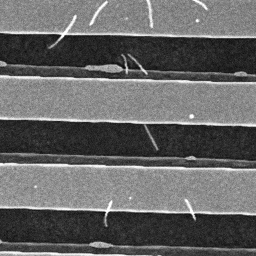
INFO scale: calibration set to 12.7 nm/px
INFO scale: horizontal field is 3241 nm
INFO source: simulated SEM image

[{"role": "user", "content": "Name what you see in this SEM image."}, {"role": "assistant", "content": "lines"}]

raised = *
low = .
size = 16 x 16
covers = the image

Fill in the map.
****************
****************
................
................
................
****************
****************
..**************
................
................
*************.**
****************
****************
................
................
................